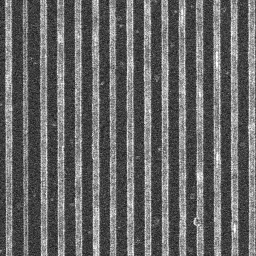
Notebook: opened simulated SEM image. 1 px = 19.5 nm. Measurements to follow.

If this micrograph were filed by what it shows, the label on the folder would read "parallel lines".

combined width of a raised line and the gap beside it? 0.339 micrometres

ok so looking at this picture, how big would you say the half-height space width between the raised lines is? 5.25 pixels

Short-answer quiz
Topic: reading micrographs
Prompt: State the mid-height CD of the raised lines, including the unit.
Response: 0.236 um